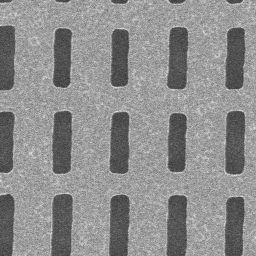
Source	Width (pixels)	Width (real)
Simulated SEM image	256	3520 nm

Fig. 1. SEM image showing a regular array of holes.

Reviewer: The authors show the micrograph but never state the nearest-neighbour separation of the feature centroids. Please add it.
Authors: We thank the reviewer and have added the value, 57.4 pixels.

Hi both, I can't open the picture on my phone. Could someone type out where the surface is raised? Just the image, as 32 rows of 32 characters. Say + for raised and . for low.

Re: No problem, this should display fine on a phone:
+++++++++++++++++++++++++++++.++
++++++++++++++++++++++++++++++++
++++++++++++++++++++++++++++++++
..++++++++++++++++++++.++++++.++
..+++++..+++++..+++++...++++...+
..+++++..+++++..+++++...++++...+
..+++++..+++++..+++++..+++++...+
..+++++..+++++..+++++..+++++...+
..+++++..+++++..+++++..+++++..++
..+++++..+++++..+++++..+++++...+
..+++++..+++++..+++++..+++++..++
++++++++++++++++++++++++++++++++
++++++++++++++++++++++++++++++++
++++++++++++++++++++++++++++++++
..+++++..+++++..+++++..+++++...+
..+++++..+++++..+++++..+++++...+
..+++++..+++++..+++++..+++++...+
..++++...+++++..+++++..+++++...+
..++++...+++++..+++++..+++++...+
..++++...+++++..+++++..+++++...+
..++++...+++++..+++++..+++++...+
.++++++..+++++..++++++++++++..++
++++++++++++++++++++++++++++++++
++++++++++++++++++++++++++++++++
..+++++..+++++..+++++..+++++++++
..++++...+++++..+++++..+++++...+
..++++...+++++..+++++..+++++...+
..++++...+++++..+++++..+++++..++
..++++...+++++..+++++..+++++..++
..++++...+++++..+++++..+++++..++
..++++...+++++..+++++..+++++..++
..++++...+++++..+++++..+++++..++